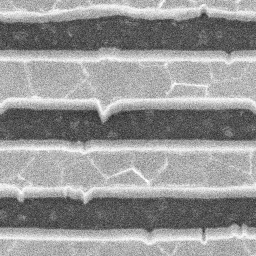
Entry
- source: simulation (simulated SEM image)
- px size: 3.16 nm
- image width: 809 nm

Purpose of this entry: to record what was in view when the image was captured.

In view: one or a few lines or trenches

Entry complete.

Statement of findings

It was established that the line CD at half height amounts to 48.1 pixels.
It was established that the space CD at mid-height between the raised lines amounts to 40.7 px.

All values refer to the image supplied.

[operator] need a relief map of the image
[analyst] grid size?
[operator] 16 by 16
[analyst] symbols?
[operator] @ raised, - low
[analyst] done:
@@@@@@@@@@@@@@@@
----------------
----------------
@@@@--@@@@@----@
@@@@@@@@@@@@@@@@
@@@@@@@@@@@@@@@@
@-@@@@@@@@-----@
----------------
----------------
@@@@@@@@@@@@@@@@
@@@@@@@@@@@@@@@@
@@@@@@@@@@@@@@@@
----------------
----------------
--------------@@
@@@@@@@@@@@@@@@@